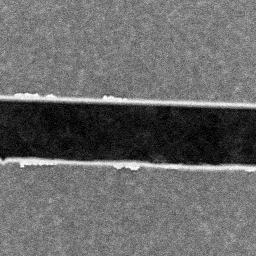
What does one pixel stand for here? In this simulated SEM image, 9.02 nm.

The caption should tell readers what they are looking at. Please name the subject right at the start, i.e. one or a few lines or trenches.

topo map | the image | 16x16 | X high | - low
XXXXXXXXXXXXXXXX
XXXXXXXXXXXXXXXX
XXXXXXXXXXXXXXXX
XXXXXXXXXXXXXXXX
XXXXXXXXXXXXXXXX
XXXXXXXXXXXXXXXX
-------------XXX
----------------
----------------
----------------
XXXXXXXXXXXX--X-
XXXXXXXXXXXXXXXX
XXXXXXXXXXXXXXXX
XXXXXXXXXXXXXXXX
XXXXXXXXXXXXXXXX
XXXXXXXXXXXXXXXX